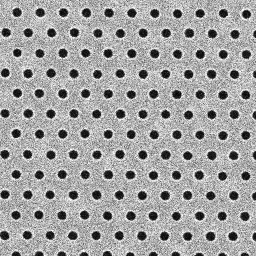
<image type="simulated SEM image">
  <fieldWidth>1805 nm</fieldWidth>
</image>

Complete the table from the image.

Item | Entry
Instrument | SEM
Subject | a regular array of holes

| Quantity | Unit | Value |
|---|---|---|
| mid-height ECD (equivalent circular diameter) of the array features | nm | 64.2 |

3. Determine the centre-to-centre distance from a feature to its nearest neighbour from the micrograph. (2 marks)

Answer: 0.159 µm